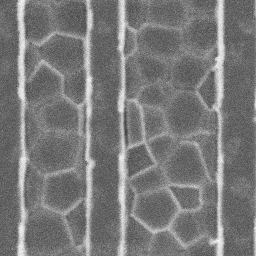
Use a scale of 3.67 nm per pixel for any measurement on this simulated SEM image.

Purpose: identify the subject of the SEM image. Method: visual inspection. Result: one or a few lines or trenches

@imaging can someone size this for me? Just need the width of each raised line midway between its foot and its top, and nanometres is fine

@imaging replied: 135